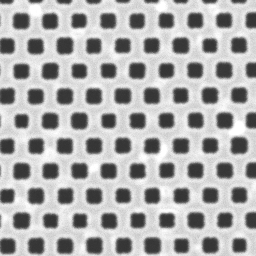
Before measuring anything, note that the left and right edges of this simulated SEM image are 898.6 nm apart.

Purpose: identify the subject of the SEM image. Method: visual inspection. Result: a regular array of holes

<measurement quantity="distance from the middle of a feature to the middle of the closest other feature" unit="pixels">28.6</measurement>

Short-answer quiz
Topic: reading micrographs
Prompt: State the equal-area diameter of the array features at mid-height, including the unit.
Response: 62.8 nm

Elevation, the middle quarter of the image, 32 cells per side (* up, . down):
**....***....***....****....***.
**....***....***....****....***.
**....***....***....***.....***.
**...*****..*****...****...****.
********************************
********************************
..****...****....***....***....*
..***.....***....***....***....*
..***.....***....***....***....*
..****...****....***....***....*
********************************
********************************
**....****...****...****...****.
**....***....***.....**.....***.
**....***....***....***.....***.
**....***....***....****...****.
********************************
********************************
.*****...****...************...*
..***.....***....***....***....*
...**.....***....***....***....*
...**.....***....***....***....*
..****...****...************.***
********************************
**************************.*****
**....***....****...****....***.
**....***....***....****....***.
**....***....***....****....***.
**....****...****...****...****.
********************************
********************************
..****...****...****....***....*